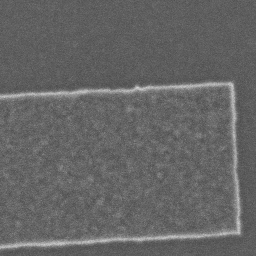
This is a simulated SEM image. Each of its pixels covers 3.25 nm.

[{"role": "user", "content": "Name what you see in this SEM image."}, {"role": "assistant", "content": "one or a few lines or trenches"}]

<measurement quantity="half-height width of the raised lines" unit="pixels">151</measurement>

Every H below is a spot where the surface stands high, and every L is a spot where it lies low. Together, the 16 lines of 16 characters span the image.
LLLLLLLLLLLLLLLL
LLLLLLLLLLLLLLLL
LLLLLLLLLLLLLLLL
LLLLLLLLLLLLLLLL
LLLLLLLLLLLLLLLL
LLLLLLLLLHHHHHLL
HHHHHHHHHHHHHHHL
HHHHHHHHHHHHHHHL
HHHHHHHHHHHHHHHL
HHHHHHHHHHHHHHHL
HHHHHHHHHHHHHHHL
HHHHHHHHHHHHHHHL
HHHHHHHHHHHHHHHL
HHHHHHHHHHHHHHHL
HHHHHHHHHHHHHHHL
LLLLLLLLLLLLLLLL